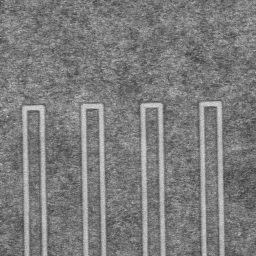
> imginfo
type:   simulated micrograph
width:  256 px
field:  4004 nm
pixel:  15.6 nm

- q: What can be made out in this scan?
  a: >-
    parallel lines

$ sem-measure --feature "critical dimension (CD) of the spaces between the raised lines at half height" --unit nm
649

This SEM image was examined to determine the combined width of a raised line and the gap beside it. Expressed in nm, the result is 924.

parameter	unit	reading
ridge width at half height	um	0.268